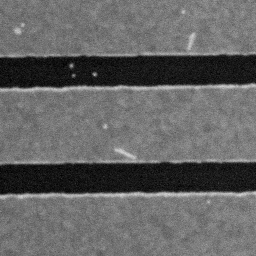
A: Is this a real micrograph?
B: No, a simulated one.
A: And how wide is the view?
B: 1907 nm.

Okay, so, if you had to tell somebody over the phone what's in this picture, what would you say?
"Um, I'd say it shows lines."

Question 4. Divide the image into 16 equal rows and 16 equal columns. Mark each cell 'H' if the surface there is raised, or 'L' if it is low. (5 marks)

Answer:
HHHHHHHHHHHHHHHH
HHHHHHHHHHHHHHHH
HHHHHHHHHHHHHHHH
HHLLLLLLLLLLLLLL
LLLLLLLLLLLLLLLL
LLLLHHHHHHHHHHHH
HHHHHHHHHHHHHHHH
HHHHHHHHHHHHHHHH
HHHHHHHHHHHHHHHH
HHHHHHHHHHHHHHHH
LLLLLLLLLLLLLLLL
LLLLLLLLLLLLLLLL
HHHHHHHHHHHHHHHH
HHHHHHHHHHHHHHHH
HHHHHHHHHHHHHHHH
HHHHHHHHHHHHHHHH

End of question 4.